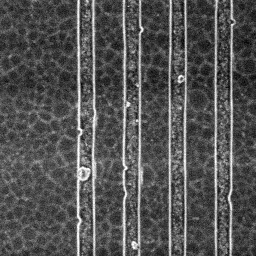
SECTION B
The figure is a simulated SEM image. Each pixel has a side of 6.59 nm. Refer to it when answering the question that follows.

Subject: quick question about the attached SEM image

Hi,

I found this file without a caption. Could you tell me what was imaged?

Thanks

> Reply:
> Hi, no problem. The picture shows parallel lines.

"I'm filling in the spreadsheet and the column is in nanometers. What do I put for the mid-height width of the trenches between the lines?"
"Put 96.4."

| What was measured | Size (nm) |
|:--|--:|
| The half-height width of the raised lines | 204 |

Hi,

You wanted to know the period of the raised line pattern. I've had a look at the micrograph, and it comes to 302 nm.